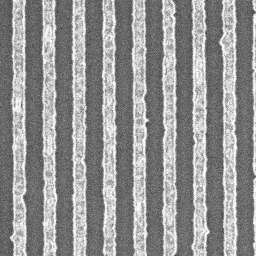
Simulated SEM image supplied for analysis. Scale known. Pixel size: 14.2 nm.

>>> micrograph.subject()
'parallel lines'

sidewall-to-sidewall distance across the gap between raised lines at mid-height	270	nanometres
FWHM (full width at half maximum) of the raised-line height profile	0.149	microns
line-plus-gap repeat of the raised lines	0.428	µm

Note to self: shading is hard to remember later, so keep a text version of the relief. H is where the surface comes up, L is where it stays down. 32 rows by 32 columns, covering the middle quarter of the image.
LLHHHLLLLLHHLLLLLHHHLLLLLHHHLLLL
LLLHHLLLLLHHLLLLLLHHLLLLLHHHLLLL
LLLHHLLLLLHHLLLLLLHHLLLLLHHHLLLL
LLLHHLLLLLHHHLLLLLHHLLLLLHHHLLLL
LLLHHLLLLLHHHLLLLLHHLLLLLHHHLLLL
LLHHHLLLLLHHHLLLLLHHLLLLLHHHLLLL
LLLHHLLLLLHHHLLLLLHHLLLLLHHHLLLL
LLLHHLLLLLHHHLLLLLHHLLLLLHHHLLLL
LLLHHLLLLLHHHLLLLLHHLLLLLHHHLLLL
LLLHHLLLLLHHHLLLLLHHLLLLLHHHLLLL
LLLHHLLLLLHHHLLLLLHHLLLLLHHHLLLL
LLLHHLLLLLHHHLLLLLHHLLLLLHHHLLLL
LLLHHLLLLLHHHLLLLLHHLLLLLHHHLLLL
LLHHHLLLLLHHHLLLLLHHLLLLLHHHLLLL
LLHHHLLLLLHHHLLLLLHHLLLLLHHHLLLL
LLHHHLLLLLHHHLLLLLHHLLLLLHHHLLLL
LLLHHLLLLLHHHLLLLLHHLLLLLHHHLLLL
LLHHHLLLLLHHHLLLLLHHLLLLLHHHLLLL
LLHHHLLLLLHHHLLLLLHHLLLLLHHHLLLL
LLLHHLLLLLHHHLLLLLHHLLLLLHHHLLLL
LLLHHLLLLLHHHLLLLLHHLLLLLHHHLLLL
LLLHHLLLLLHHHLLLLLHHLLLLLHHLLLLL
LLLHHLLLLLHHHLLLLLHHLLLLLHHHLLLL
LLHHHLLLLLHHHLLLLLHHLLLLLHHHLLLL
LLHHHLLLLLHHHLLLLHHHLLLLLHHHLLLL
LLLHHLLLLLHHHLLLLLHHLLLLLHHLLLLL
LLHHHLLLLLHHHLLLLLHHLLLLLHHHLLLL
LLHHHLLLLLHHHLLLLLHHLLLLLHHHLLLL
LLLHHLLLLLHHHLLLLLHHLLLLLHHHLLLL
LLLHHLLLLLHHHLLLLLHHLLLLLHHHLLLL
LLLHHLLLLLHHHLLLLLHHLLLLLHHHLLLL
LLLHHLLLLLHHHLLLLLHHLLLLLHHHLLLL